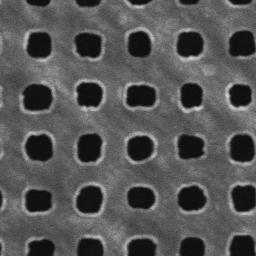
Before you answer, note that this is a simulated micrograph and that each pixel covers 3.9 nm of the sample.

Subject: a regular array of holes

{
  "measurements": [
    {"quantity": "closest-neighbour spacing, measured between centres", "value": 196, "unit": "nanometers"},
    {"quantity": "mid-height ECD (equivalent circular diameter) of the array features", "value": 0.102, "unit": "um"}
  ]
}